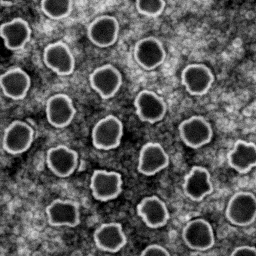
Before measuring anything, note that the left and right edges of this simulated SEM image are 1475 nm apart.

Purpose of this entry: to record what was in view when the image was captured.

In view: a regular array of raised bodies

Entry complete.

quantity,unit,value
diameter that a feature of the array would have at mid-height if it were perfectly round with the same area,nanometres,172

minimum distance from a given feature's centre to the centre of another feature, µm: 0.291